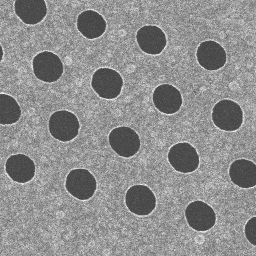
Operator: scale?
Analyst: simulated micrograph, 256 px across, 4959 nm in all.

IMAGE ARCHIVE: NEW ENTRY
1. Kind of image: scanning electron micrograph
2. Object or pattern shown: a regular array of holes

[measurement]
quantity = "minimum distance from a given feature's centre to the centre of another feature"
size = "60.7 px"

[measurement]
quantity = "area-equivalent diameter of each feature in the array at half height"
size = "30.4 px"